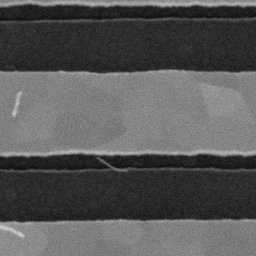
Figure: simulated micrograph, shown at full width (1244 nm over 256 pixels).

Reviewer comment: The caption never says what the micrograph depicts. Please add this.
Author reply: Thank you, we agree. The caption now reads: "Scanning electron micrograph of lines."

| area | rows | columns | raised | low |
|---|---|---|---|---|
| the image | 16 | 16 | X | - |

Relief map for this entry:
----------------
----------------
----------------
----------------
X--X-----XXXX---
XXXXXXXXXXXXXXXX
XXXXXXXXXXXXXXXX
XXXXXXXXXXXXXXXX
XXXXXXXXXXXXXXXX
XXXXXXXXXXXXXXXX
----------------
----------------
----------------
----------------
XXXXXXXXXXXXXXXX
XXXXXXXXXXXXXXXX